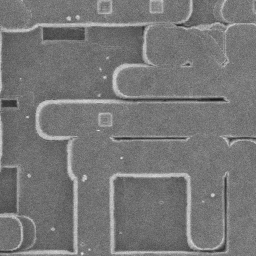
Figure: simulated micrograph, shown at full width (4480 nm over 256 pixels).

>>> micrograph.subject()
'wiring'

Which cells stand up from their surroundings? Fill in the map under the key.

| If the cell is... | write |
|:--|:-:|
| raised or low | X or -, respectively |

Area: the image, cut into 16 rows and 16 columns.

XXXXXXXXXXXX--XX
XXXXXXXXXXXX-XXX
---------XXXXXXX
---------XXXXXXX
-------XXXXXXXXX
-------XXXXXXXXX
---XXXXXXXXXXXXX
--XXXXXXXXXXXXXX
---XXXXXXXXXXXXX
----XXXXXXXXXXXX
----XXXXXXXXXXXX
-----XX-----XXXX
-----XX-----XXXX
-----XX-----XXXX
X----XX-----XXXX
X----XX-----XXXX